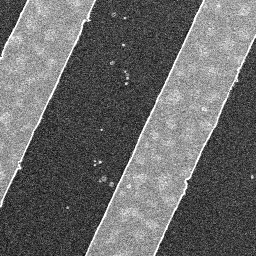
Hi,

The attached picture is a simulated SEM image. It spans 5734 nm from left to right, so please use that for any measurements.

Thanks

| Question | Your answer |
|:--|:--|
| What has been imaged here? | one or a few lines or trenches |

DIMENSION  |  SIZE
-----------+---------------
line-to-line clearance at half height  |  2.2 microns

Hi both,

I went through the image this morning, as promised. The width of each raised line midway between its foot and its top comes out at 1400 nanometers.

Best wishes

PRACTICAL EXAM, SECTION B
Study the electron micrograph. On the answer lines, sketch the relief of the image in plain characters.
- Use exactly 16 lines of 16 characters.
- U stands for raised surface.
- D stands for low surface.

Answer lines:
DDUUUUDDDDDDUUUU
DUUUUDDDDDDDUUUU
DUUUUDDDDDDDUUUU
UUUUDDDDDDDUUUUD
UUUUDDDDDDDUUUUD
UUUDDDDDDDUUUUDD
UUUDDDDDDDUUUUDD
UUDDDDDDDUUUUUDD
UUDDDDDDDUUUUDDD
UUDDDDDDUUUUUDDD
UDDDDDDDUUUUDDDD
UDDDDDDUUUUUDDDD
DDDDDDDUUUUDDDDD
DDDDDDDUUUUDDDDD
DDDDDDUUUUDDDDDD
DDDDDDUUUUDDDDDD